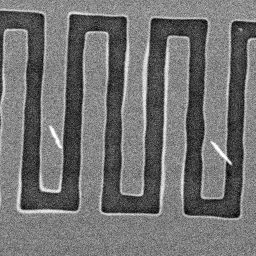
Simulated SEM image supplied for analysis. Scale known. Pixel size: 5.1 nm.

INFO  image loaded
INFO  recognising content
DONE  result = groups of lines, slits or small figures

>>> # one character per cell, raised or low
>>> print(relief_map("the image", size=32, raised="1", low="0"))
11111111111111111111111111111111
00001111111111111111111111111111
00000011100000001110000000111111
00000011100000001110000000111000
11100011000111001110000000111000
11100011000110001110011100111001
11100011000110001100011100111001
11100011000110001100011100111001
11100111000110001100011100111001
11100111000110001100011100111001
11100111000110001100011100111001
11100111000110001100011000111001
11100111001110011100011001110001
11100111001110011100011001110001
11100111001110011100011001110001
11100111001110011100011000110001
11100111001110011100011000110011
11100111001110011100011001110011
11100111001110011100011001110011
11100111001110011100111001110001
11100111001110011100111001110011
11100111001110011100111001110011
11100111001110011100111001110011
11100110001110011100111001110011
11000000001110000000111001110011
11000000001110000000111000000011
11101111011110000000111000000011
11111111111111111111111111111111
11111111111111111111111111111111
11111111111111111111111111111111
11111111111111111111111111111111
11111111111111111111111111111111